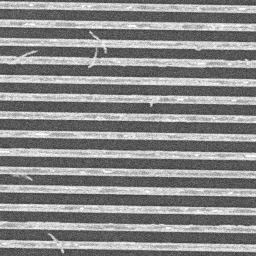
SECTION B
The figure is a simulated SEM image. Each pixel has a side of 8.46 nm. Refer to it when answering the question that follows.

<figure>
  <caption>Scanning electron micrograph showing parallel lines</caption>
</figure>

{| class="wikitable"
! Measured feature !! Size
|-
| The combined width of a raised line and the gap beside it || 155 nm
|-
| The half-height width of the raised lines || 48.6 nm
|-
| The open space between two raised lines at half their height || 105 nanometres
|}